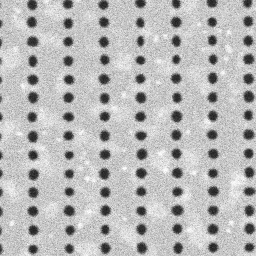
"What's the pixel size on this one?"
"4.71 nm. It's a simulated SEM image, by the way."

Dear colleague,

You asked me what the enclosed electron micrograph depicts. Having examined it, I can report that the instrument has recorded a regular array of holes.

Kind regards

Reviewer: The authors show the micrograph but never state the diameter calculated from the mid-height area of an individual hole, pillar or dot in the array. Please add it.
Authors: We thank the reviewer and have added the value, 50.6 nanometres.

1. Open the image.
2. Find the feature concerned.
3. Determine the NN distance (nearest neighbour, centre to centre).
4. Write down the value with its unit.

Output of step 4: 18.6 pixels